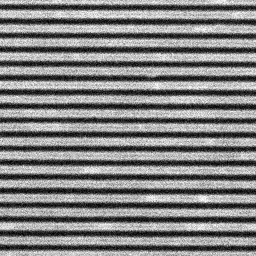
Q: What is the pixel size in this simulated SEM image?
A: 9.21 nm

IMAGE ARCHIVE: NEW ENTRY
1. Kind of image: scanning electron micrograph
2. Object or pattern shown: parallel lines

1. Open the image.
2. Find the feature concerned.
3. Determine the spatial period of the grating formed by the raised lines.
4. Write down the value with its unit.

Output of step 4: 130 nm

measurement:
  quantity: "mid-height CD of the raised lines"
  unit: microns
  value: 0.0507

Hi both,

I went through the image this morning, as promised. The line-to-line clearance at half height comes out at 84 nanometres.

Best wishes